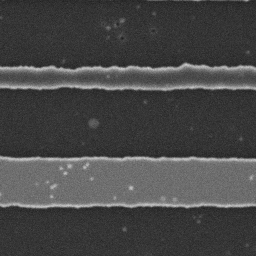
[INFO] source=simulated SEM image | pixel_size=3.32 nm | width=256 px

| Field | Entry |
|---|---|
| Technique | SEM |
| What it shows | lines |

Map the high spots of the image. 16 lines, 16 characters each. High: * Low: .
................
................
................
................
****************
****.***********
................
................
................
................
****************
****************
****************
................
................
................